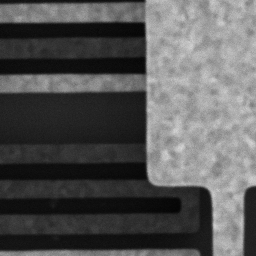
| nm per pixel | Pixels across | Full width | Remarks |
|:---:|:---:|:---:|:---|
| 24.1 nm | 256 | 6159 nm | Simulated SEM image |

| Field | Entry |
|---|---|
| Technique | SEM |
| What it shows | wiring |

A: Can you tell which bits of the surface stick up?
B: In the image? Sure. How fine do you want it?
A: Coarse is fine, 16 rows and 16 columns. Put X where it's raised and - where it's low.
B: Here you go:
---------XXXXXXX
---------XXXXXXX
---------XXXXXXX
---------XXXXXXX
---------XXXXXXX
---------XXXXXXX
---------XXXXXXX
---------XXXXXXX
---------XXXXXXX
---------XXXXXXX
---------XXXXXXX
----------XXXXXX
-------------XX-
-------------XX-
-------------XX-
-------------XX-